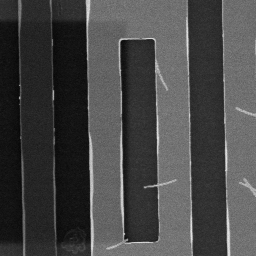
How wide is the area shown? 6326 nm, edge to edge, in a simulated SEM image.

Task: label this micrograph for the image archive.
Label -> groups of lines, slits or small figures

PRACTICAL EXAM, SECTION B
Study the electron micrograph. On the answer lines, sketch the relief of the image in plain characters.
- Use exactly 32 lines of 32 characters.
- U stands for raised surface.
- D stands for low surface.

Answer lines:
DDDUUUDDDDDUUUUUUUUUUUUDDDDDUUUU
DDDUUUDDDDDUUUUUUUUUUUUDDDDDUUUU
DDDUUUDDDDDUUUUUUUUUUUUDDDDDUUUU
DDUUUUDDDDDUUUUUUUUUUUUDDDDDUUUU
DDUUUUDDDDDUUUUUUUUUUUUDDDDDUUUU
DDUUUUDDDDDUUUUDDDDUUUUDDDDDUUUU
DDUUUUDDDDDUUUUDDDDUUUUDDDDDUUUU
DDDUUUDDDDDUUUUDDDDDUUUDDDDDUUUU
DDDUUUUDDDDUUUUDDDDDUUUUDDDDUUUU
DDDUUUUDDDDUUUUDDDDDUUUUDDDDUUUU
DDDUUUUDDDDUUUUDDDDDUUUUDDDDUUUU
DDDUUUUDDDDUUUUDDDDDUUUUDDDDUUUU
DDDUUUUDDDDUUUUDDDDDUUUUDDDDUUUU
DDDUUUUDDDDUUUUDDDDDUUUUDDDDUUUU
DDDUUUUDDDDUUUUDDDDDUUUUDDDDUUUU
DDDUUUUDDDDUUUUDDDDDUUUUDDDDUUUU
DDDUUUUDDDDUUUUDDDDDUUUUDDDDUUUU
DDDUUUUDDDDUUUUDDDDDUUUUDDDDUUUU
DDDUUUUDDDDUUUUDDDDDUUUUDDDDUUUU
DDDUUUUDDDDUUUUDDDDDUUUUDDDDUUUU
DDDUUUUDDDDUUUUDDDDDUUUUDDDDUUUU
DDDUUUUDDDDUUUUDDDDDUUUUDDDDUUUU
DDDUUUUDDDDDUUUDDDDDUUUUDDDDUUUU
DDDUUUUDDDDDUUUDDDDDUUUUDDDDUUUU
DDDUUUUDDDDUUUUDDDDDUUUUDDDDUUUU
DDDUUUUDDDDUUUUDDDDDUUUUDDDDUUUU
DDDUUUUDDDDUUUUDDDDDUUUUDDDDUUUU
DDDUUUUDDDDDUUUDDDDDUUUUDDDDUUUU
DDDUUUUDDDDDUUUDDDDDUUUUDDDDDUUU
DDDUUUUDDDDDUUUUDDDDUUUUDDDDDUUU
DDDUUUUDDUDDUUUUUUUUUUUUDDDDDUUU
DDDUUUUDDDDDUUUUUUUUUUUUDDDDDUUU